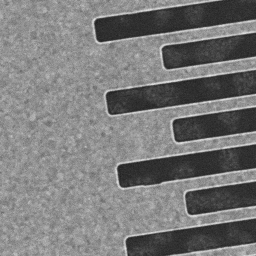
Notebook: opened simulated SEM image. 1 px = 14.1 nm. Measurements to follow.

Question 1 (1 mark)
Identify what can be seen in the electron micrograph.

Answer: parallel lines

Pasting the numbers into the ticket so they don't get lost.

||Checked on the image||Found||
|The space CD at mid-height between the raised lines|366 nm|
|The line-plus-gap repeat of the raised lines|521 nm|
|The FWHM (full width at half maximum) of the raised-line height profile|164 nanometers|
